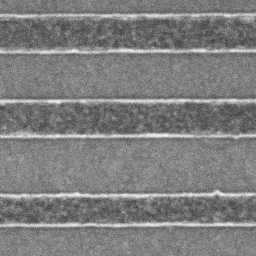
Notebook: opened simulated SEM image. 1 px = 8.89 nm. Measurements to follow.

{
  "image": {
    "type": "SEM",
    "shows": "one or a few lines or trenches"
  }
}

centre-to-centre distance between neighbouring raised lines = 785 nanometers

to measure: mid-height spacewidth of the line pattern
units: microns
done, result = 0.466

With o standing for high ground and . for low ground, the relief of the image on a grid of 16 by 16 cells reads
................
oooooooooooooooo
oooooooooooooooo
................
................
................
oooooooooooooooo
oooooooooooooooo
oooooooooooooooo
................
................
................
oooooooooooooooo
oooooooooooooooo
................
................